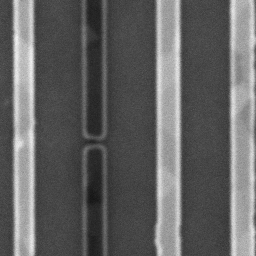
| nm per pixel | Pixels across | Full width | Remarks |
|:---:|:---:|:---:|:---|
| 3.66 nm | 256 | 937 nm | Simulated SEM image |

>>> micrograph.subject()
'one or a few lines or trenches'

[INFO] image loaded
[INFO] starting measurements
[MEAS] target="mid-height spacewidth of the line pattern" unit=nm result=193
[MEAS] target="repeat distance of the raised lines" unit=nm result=267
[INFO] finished